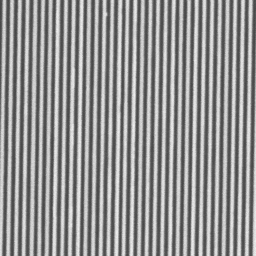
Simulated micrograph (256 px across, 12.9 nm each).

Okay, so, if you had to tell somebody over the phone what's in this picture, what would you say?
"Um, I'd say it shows parallel lines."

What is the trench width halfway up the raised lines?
4.62 px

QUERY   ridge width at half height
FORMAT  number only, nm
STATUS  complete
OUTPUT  48.3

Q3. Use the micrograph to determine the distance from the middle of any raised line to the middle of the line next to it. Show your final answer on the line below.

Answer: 99.2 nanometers